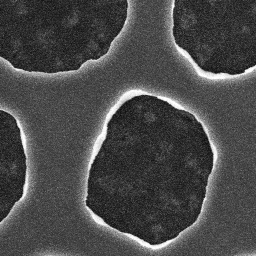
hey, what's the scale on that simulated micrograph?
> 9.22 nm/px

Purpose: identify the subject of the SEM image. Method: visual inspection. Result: holes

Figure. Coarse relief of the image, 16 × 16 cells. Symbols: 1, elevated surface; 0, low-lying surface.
0000000011100000
0000000011100000
0000000111100000
0000001111110000
1100111111111001
1111111111111111
1111111000011111
0111111000001111
0111110000000111
0011110000000111
0011110000000111
0011100000000111
0111100000000111
1111110000001111
1111111100011111
1111111111111111